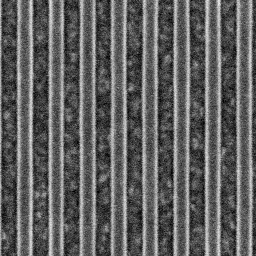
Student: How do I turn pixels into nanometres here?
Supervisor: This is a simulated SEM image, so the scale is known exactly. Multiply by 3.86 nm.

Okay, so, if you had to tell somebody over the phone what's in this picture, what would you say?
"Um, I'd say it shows parallel lines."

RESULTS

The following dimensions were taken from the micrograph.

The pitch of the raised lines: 121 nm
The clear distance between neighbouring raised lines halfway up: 65.6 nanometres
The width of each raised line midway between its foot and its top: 52.6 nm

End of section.